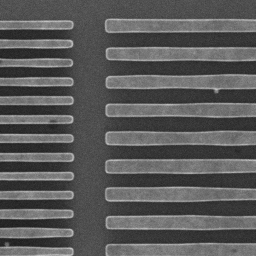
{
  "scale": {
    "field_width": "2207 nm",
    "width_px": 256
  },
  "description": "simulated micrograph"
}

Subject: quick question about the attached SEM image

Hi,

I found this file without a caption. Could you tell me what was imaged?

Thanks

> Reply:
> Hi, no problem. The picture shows groups of lines, slits or small figures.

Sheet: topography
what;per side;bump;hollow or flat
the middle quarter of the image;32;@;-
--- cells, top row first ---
@@------------------------------
--------------------------------
--------------------------------
@@---------@@@@@@@@@@@@@@@@@@@@@
@@---------@@@@@@@@@@@@@@@@@@@@@
-----------@@@@@@@@@@@@@@@@@@@@@
--------------------------------
--------------------------------
@@------------------------------
@@------------------------------
-----------@@@@@@@@@@@@@@@@@@@@@
-----------@@@@@@@@@@@@@@@@@@@@@
-----------@@@@@@@@@@@@@@@@@@@@@
@@------------------------------
@@------------------------------
--------------------------------
--------------------------------
-----------@@@@@@@@@@@@@@@@@@@@@
@@---------@@@@@@@@@@@@@@@@@@@@@
-----------@@@@@@@@@@@@@@@@@@@@@
--------------------------------
--------------------------------
@@------------------------------
@@------------------------------
-----------@@@@@@@@@@@@@@@@@@@@@
-----------@@@@@@@@@@@@@@@@@@@@@
-----------@@@@@@@@@@@@@@@@@@@@@
@@------------------------------
@@------------------------------
--------------------------------
--------------------------------
-----------@@@@@@@@@@@@@@@@@@@@@